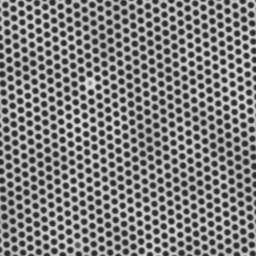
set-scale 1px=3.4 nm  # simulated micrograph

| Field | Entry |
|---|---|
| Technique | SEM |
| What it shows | a regular array of holes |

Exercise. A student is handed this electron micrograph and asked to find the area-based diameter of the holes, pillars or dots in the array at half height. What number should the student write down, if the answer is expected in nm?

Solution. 21.7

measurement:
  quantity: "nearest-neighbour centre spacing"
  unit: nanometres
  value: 30.3